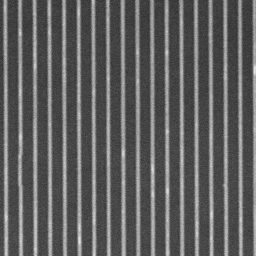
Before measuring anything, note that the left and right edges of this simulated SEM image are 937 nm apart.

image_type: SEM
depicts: parallel lines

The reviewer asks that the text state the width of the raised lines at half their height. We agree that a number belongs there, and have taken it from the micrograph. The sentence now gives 12.4 nanometers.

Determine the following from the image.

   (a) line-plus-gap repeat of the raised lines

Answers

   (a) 0.0537 um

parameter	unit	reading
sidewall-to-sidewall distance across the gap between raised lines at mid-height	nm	41.6